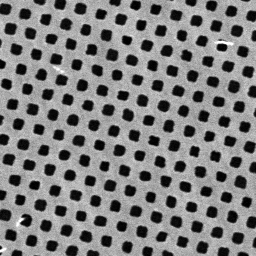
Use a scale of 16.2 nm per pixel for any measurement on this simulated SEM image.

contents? a regular array of holes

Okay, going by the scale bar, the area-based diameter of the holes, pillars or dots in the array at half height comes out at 189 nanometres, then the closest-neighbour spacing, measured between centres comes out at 332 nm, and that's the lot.